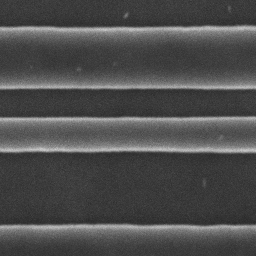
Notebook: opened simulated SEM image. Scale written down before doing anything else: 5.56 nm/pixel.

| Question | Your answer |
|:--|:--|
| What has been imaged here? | lines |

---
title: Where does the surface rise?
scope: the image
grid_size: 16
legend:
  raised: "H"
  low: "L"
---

LLLLLLLLLLLLLLLL
LLLLLLLLLLLLLLLL
HHHHHHHHHHHHHHHH
HHHHHHHHHHHHHHHH
HHHHHHHHHHHHHHHH
HHHHHHHHHHHHHHHH
HHHHHHHHHHHHHHHH
HHHHHHHHHHHHHHHH
HHHHHHHHHHHHHHHH
LLLLLLLLLLLLLLLL
LLLLLLLLLLLLLLLL
LLLLLLLLLLLLLLLL
LLLLLLLLLLLLLLLL
LLLLLLLLLLLLLLLL
HHHHHHHHHHHHHHHH
HHHHHHHHHHHHHHHH